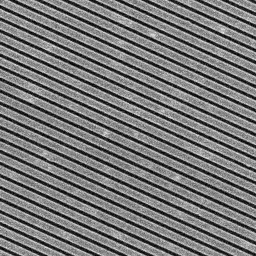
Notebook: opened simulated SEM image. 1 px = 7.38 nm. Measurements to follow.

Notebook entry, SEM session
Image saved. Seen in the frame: parallel lines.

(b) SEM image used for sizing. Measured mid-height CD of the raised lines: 0.0538 microns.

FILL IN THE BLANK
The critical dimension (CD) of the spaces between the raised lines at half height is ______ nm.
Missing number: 26.9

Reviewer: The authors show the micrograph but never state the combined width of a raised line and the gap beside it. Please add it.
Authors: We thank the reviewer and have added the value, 81 nm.